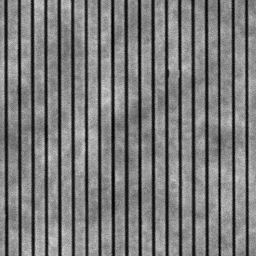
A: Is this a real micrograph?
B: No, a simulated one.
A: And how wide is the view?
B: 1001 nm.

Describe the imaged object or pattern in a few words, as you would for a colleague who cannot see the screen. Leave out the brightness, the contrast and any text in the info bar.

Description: parallel lines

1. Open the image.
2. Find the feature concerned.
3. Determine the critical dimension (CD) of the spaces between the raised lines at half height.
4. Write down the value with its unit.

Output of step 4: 10.3 nm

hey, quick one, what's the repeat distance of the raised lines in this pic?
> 52.2 nm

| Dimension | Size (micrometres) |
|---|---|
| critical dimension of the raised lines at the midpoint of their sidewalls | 0.0405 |